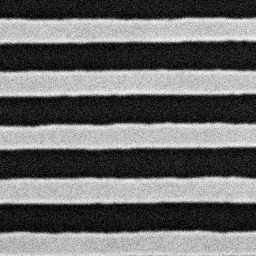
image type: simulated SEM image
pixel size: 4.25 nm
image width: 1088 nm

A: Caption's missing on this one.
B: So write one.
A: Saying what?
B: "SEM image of lines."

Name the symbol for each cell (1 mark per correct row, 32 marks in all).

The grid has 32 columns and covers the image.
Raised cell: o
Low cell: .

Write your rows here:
................................
................................
ooo.....ooooooo......ooooooooooo
oooooooooooooooooooooooooooooooo
oooooooooooooooooooooooooooooooo
................................
................................
................................
................................
oooooooooooooooooooooooooooooooo
oooooooooooooooooooooooooooooooo
oooooooooooooooooooooooooooooooo
................................
................................
................................
....................oo....oo....
oooooooooooooooooooooooooooooooo
oooooooooooooooooooooooooooooooo
ooo........oo...................
................................
................................
................................
.ooooooooooooooooooooooooooooooo
oooooooooooooooooooooooooooooooo
oooooooooooooooooooooooooooooooo
................................
................................
................................
................................
oooooooooooooooooooooooooooooooo
oooooooooooooooooooooooooooooooo
oooooooooooooooooooooooooooooooo